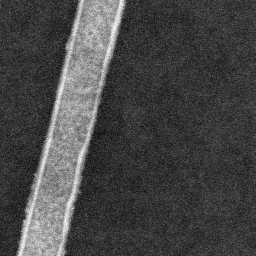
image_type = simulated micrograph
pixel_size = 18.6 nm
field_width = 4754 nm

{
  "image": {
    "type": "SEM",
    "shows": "one or a few lines or trenches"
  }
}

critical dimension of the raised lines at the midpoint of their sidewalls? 674 nanometres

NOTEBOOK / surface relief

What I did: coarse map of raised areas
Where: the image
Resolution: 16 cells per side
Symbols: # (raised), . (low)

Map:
.....###........
.....##.........
.....##.........
....###.........
....##..........
....##..........
....##..........
...###..........
...##...........
...##...........
...##...........
..###...........
..##............
..##............
..##............
.###............